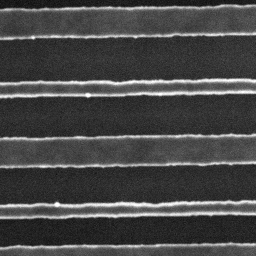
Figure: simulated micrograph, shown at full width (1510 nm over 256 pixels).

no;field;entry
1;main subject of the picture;lines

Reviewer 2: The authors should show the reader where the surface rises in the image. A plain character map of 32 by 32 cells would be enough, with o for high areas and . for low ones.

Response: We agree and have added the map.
................................
oooooooooooooooooooooooooooooooo
oooooooooooooooooooooooooooooooo
oooooooooooooooooooooooooooooooo
oooooooooooooooooooooo..........
................................
................................
................................
................................
................................
oooooooooooooooooooooooooooooooo
oooooooooooooooooooooooooooooooo
................................
................................
................................
................................
................................
oooooooooooooooooooooooooooooooo
oooooooooooooooooooooooooooooooo
oooooooooooooooooooooooooooooooo
ooooooooooooooooooooooooooooo...
................................
................................
................................
................................
.....ooo...oooooooo.oooooooooooo
oooooooooooooooooooooooooooooooo
................................
................................
................................
........................oooooooo
oooooooooooooooooooooooooooooooo